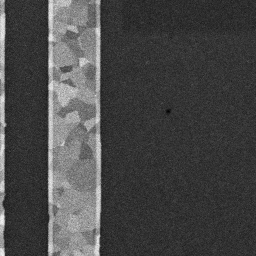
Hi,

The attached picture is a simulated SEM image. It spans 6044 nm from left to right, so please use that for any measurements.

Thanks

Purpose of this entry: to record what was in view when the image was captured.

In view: one or a few lines or trenches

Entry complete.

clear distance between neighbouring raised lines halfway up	1160	nanometers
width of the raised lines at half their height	1120	nm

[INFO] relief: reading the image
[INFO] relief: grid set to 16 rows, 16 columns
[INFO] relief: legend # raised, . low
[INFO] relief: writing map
...###..........
...###..........
...###..........
...###..........
...###..........
...###..........
...###..........
...###..........
...###..........
...###..........
...###..........
...###..........
...###..........
...###..........
...###..........
...###..........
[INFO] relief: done